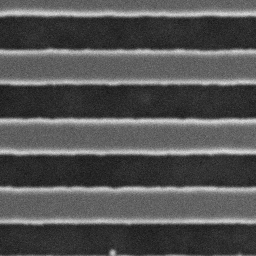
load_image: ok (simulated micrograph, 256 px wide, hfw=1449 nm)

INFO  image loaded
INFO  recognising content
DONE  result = lines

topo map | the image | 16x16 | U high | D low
UUUUUUUUUUUUUUUU
DDDDDDDDDDDDDDDD
DDDDDDDDDDDDDDDD
UUUUUUUUUUUUUUUU
UUUUUUUUUUUUUUUU
DDDDDDDDDDDDDDDD
DDDDDDDDDDDDDDDD
UUUUUDDUUDDDDDDD
UUUUUUUUUUUUUUUU
UUUUUUUUUUUUUUUU
DDDDDDDDDDDDDDDD
DDDDDDDDDDDDDDDD
UUUUUUUUUUUUUUUU
UUUUUUUUUUUUUUUU
DDDDDDDDDDDDDDDD
DDDDDDDDDDDDDDDD